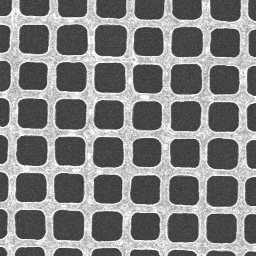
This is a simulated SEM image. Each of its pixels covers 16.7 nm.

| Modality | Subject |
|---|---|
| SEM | a regular array of holes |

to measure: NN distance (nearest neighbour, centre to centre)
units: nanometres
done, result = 616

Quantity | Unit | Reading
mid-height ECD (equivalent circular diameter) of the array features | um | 0.549